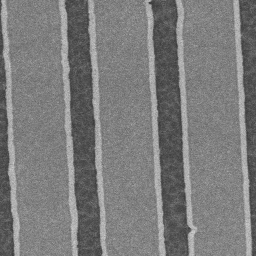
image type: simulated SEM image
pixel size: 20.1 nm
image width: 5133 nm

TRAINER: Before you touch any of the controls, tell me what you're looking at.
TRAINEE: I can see one or a few lines or trenches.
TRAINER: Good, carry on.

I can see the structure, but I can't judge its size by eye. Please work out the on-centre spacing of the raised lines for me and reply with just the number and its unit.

1750 nm